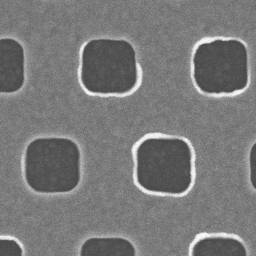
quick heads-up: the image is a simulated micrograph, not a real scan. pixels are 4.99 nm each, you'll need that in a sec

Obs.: holes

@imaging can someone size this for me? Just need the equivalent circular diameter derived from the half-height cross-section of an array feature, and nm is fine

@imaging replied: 287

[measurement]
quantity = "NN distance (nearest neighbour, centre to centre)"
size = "0.559 microns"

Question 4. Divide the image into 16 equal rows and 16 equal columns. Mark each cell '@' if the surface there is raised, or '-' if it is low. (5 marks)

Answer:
@@@@@@@@@@@@@@@@
@@@@@@@@@@@@@@@@
-@@@@@-@@@@@@@@@
-@@@@---@@@@---@
-@@@@---@@@@---@
-@@@@---@@@@@--@
@@@@@@@@@@@@@@@@
@@@@@@@@@@@@@@@@
@@@@@@@@@@@@@@@@
@@---@@@@---@@@@
@@---@@@@---@@@@
@@---@@@@---@@@@
@@@@@@@@@@@@@@@@
@@@@@@@@@@@@@@@@
@@@@@@@@@@@@@@@@
-@@@@---@@@@---@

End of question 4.